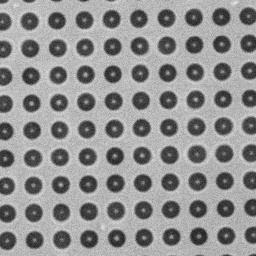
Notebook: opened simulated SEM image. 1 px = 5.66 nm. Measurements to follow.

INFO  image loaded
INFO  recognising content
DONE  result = an array of small figures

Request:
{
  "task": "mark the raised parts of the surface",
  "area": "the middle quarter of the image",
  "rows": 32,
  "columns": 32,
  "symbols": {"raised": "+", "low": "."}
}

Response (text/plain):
++++...+++++..+++....+++...++++.
.++....+++....+++....+++....+++.
.++..+..++.....+.....+++....+++.
.++.....++....+++....+++....+++.
++++...++++..+++++..+++++..+++++
++++++++++++++++++++++++++++++++
++++++++++++++++++++++++++.+++++
++++...++++...++++...+++....+++.
.++.....++.....++.....++.....+..
.++.....++.....++.....++.....+..
.++.....++.....++....+++....+++.
.+++...++++...+++++.++++++.++++.
++++++++++++++++++++++++++++++++
++++++++++++++++++++++++++.++++.
++++...++++....+++...+++....+++.
.++.....++.....++.....++.....+..
..+.....++.....++.....++.....++.
..+.....++.....++....+++....+++.
.+++...++++...++++++++++++++++++
++++++++++++++++++++++++++++++++
+++++++++++++++++++.+++++..++++.
.+++....+++...+++.....++.....++.
.+++.....+.....++.....++.....+..
..+......+.....++.....++.....++.
.+++....+++....+++....+++...+++.
+++++..+++++++++++++++++++++++++
++++++++++++++++++++++++++++++++
++++++++++++.++++++.++++++..++++
.+++....+++....++.....++.....++.
..++....+++.....+.....++.....++.
..++....+++....++.....++.....++.
.+++....+++....+++...++++...++++